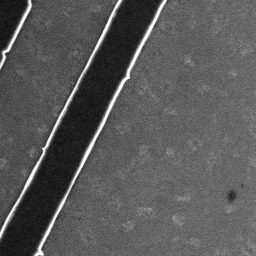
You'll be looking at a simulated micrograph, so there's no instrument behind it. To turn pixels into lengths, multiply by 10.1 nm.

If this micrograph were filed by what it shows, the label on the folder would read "one or a few lines or trenches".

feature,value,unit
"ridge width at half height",404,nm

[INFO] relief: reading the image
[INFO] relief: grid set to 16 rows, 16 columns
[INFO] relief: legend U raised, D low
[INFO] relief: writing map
UUDDDDDUUUDDDDDD
UDDDDDDUUUDDDDDD
UDDDDDUUUDDDDDDD
DDDDDDUUUDDDDDDD
DDDDDUUUDDDDDDDD
DDDDDUUUDDDDDDDD
DDDDUUUDDDDDDDDD
DDDDUUUDDDDDDDDD
DDDUUUDDDDDDDDDD
DDDUUUDDDDDDDDDD
DDUUUDDDDDDDDDDD
DDUUUDDDDDDDDDDD
DUUUDDDDDDDDDDDD
DUUDDDDDDDDDDDDD
UUUDDDDDDDDDDDDD
UUUDDDDDDDDDDDDD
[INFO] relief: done